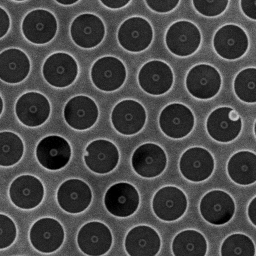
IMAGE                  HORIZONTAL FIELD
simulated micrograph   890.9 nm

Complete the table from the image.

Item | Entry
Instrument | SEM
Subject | an array of small figures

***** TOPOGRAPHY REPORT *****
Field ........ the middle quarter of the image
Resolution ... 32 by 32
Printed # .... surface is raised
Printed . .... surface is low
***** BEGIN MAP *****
...####........#####......######
....###........####........####.
...####...##....###........####.
...####........###.........###..
..#####........####........###..
.#######......#####........####.
#########....#######......#####.
#####################....#######
##....##########################
#.......######....##############
........#####.......######....##
.........###........#####.......
....#....###.........###........
........####...##....###........
#.......####........####....#...
##.....#####........####........
####.########......#####........
###############..########......#
###########################..###
.######.....####################
..####.......######.....########
..###........#####.......######.
..####...#....###........#####..
..###....#....###....#....###...
.####.........###....#....###...
######.......####........####...
#######.....######.......####...
##################......#####...
##############################..
.....###########################
......######.....#########.#####
.......####.......######.....###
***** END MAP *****